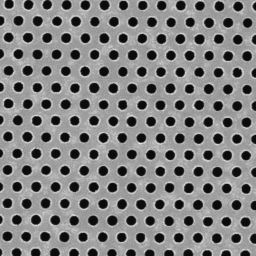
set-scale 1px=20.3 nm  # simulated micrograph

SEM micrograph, a regular array of holes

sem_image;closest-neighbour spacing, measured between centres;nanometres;381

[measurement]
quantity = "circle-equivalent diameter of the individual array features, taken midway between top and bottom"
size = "9.84 px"